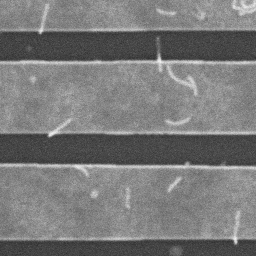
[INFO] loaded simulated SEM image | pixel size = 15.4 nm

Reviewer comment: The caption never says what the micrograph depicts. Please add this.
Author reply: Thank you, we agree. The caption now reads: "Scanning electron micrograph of lines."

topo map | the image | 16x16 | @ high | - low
@@@@@@@@@@@@@@@@
@@@@@@@@@@@@@@@@
----------------
----------------
@@@@@@@@@@@@@@@@
@@@@@@@@@@@@@@@@
@@@@@@@@@@@@@@@@
@@@@@@@@@@@@@@@@
----------------
----------------
@@@@@@@@@@@@@@@@
@@@@@@@@@@@@@@@@
@@@@@@@@@@@@@@@@
@@@@@@@@@@@@@@@@
@@@@@@@@@@@@@@@@
----------------